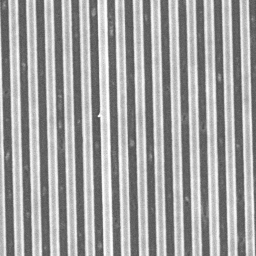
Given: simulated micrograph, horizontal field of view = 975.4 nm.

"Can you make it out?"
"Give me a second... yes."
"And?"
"parallel lines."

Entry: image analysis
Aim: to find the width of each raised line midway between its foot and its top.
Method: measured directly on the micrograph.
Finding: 8.01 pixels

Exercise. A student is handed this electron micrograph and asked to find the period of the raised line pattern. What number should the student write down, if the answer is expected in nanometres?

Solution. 67.7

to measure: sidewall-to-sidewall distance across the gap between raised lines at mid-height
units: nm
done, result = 37.1